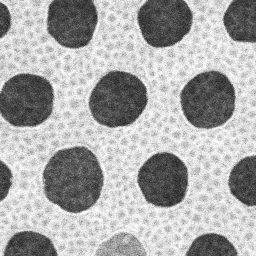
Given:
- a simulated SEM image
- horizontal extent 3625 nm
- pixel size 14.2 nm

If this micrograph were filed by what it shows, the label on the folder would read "holes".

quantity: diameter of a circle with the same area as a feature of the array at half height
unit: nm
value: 817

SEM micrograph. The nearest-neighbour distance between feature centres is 1.28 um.